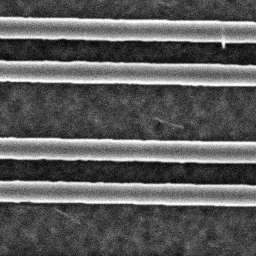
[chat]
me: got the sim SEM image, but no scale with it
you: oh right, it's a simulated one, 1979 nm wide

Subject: lines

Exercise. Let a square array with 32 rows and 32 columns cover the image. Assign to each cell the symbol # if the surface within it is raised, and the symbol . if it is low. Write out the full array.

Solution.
................................
................................
##############..................
################################
################################
................................
................................
................................
################################
################################
......................##########
................................
................................
................................
................................
................................
................................
##############..................
################################
################################
................................
................................
................................
################################
################################
....................############
................................
................................
................................
................................
................................
................................